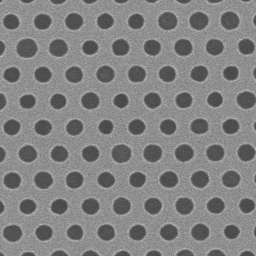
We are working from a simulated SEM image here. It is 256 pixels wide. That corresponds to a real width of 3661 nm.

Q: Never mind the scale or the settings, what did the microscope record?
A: a regular array of holes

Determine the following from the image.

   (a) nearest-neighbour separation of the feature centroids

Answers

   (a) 435 nanometers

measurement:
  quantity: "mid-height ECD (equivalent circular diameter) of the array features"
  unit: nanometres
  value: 238